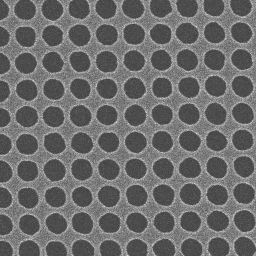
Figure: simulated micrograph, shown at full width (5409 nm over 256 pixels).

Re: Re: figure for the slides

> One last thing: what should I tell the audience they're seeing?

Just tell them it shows a regular array of holes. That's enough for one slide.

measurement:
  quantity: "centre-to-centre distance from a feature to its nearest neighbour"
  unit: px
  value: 26.5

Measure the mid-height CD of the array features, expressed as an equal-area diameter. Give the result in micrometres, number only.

0.452